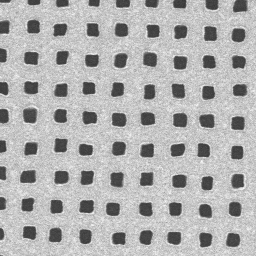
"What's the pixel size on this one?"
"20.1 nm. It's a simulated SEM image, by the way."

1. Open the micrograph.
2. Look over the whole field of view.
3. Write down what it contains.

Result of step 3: a regular array of holes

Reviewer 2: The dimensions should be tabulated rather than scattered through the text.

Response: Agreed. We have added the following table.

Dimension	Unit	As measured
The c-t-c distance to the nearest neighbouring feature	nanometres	554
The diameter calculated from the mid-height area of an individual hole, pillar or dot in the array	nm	289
